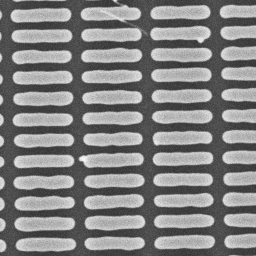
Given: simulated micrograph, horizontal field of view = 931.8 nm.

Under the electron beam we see groups of lines, slits or small figures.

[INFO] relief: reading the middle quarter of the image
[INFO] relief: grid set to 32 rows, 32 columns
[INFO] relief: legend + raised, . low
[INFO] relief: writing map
................................
.............+++.......+++++++++
++...++++++++++++++...++++++++++
++...++++++++++++++...++++++++++
++...+++++++++++................
................................
..............................++
++...++++++++++++++...++++++++++
++...++++++++++++++...++++++++++
++...++++++++++++++....+++++++++
................................
................................
+....++++++++++++++...++++++++++
++...++++++++++++++...++++++++++
++...++++++++++++++....++++++.++
................................
................................
........+++.+++++++....+++++++++
++...++++++++++++++...++++++++++
++...++++++++++++++...++++++++++
+.......+++.....................
................................
........+++++++++++....+++++++++
++..++++++++++++++++..++++++++++
++...+++++++++++++++..++++++++++
+.....+++++++++.................
................................
.........................+++.+.+
++...+++++++++++++++...+++++++++
++...+++++++++++++++..++++++++++
++....+++++++++++++....+++++....
................................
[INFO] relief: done